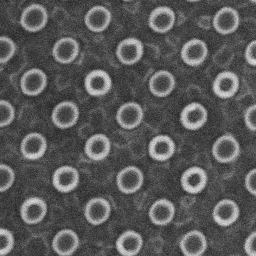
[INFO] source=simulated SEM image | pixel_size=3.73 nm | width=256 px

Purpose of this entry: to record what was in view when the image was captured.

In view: a regular array of raised bodies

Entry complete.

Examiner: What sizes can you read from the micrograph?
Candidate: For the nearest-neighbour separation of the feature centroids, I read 0.168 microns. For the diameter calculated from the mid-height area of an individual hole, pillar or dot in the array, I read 89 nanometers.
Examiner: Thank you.